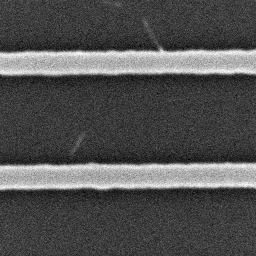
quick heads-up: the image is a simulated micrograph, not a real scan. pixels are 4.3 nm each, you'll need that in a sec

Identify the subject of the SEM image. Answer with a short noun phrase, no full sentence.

lines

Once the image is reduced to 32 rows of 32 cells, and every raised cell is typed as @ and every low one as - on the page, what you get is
--------------------------------
--------------------------------
--------------------------------
--------------------------------
--------------------------------
--------------------------------
----------------@---@--@@@@@@@@@
@@@@@@@@@@@@@@@@@@@@@@@@@@@@@@@@
@@@@@@@@@@@@@@@@@@@@@@@@@@@@@@@@
--------------------------------
--------------------------------
--------------------------------
--------------------------------
--------------------------------
--------------------------------
--------------------------------
--------------------------------
--------------------------------
--------------------------------
--------------------------------
--------------------------------
@@@@@@@@@@@@@@@@@@@@@@@@@@@@@@@@
@@@@@@@@@@@@@@@@@@@@@@@@@@@@@@@@
@@@@@@-@@---@@------------------
--------------------------------
--------------------------------
--------------------------------
--------------------------------
--------------------------------
--------------------------------
--------------------------------
--------------------------------